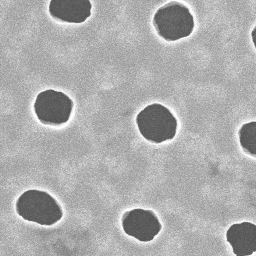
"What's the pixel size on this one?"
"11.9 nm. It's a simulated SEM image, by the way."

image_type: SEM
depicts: holes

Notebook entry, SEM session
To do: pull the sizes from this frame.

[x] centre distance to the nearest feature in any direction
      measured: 1.22 um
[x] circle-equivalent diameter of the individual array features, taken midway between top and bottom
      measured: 469 nm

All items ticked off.